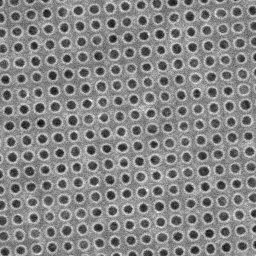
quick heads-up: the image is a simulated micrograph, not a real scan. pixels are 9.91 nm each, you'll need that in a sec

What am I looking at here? a regular array of holes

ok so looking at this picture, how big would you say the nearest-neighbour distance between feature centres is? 152 nm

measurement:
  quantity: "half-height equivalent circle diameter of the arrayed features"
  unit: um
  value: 0.0949